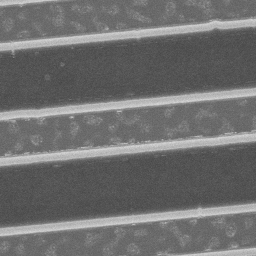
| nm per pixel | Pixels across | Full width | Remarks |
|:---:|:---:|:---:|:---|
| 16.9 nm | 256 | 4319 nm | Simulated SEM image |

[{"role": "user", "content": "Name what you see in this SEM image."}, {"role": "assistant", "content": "one or a few lines or trenches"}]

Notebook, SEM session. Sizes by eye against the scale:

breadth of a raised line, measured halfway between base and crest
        764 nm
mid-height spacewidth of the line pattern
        1160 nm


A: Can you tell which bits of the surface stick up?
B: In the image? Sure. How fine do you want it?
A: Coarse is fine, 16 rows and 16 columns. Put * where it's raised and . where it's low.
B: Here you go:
****************
***************.
*****...........
................
................
................
........********
****************
****************
******..........
................
................
................
..........******
****************
****************